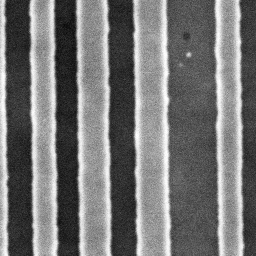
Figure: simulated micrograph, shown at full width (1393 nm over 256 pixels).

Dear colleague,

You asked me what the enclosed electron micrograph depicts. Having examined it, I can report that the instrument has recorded lines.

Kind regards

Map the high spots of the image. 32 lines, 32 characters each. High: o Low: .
o...ooo...ooo....oooo......ooo..
o...ooo...ooo....oooo......ooo..
o...ooo...ooo....oooo......ooo..
o...ooo...ooo....oooo......ooo..
o...ooo...ooo....oooo......ooo..
o...ooo...ooo....oooo......ooo..
o...ooo...ooo....oooo......ooo..
o...ooo...ooo....oooo......ooo..
o...ooo...ooo....oooo......ooo..
o...ooo...ooo....oooo......ooo..
o...ooo...oooo...oooo......ooo..
o...ooo...oooo...oooo......ooo..
o...ooo...oooo...oooo......ooo..
o...ooo...oooo...oooo......ooo..
o...ooo...ooo....oooo......ooo..
o...ooo...ooo....oooo......ooo..
o...ooo...ooo....oooo......ooo..
o...ooo...ooo....oooo......ooo..
o...ooo...oooo...oooo......ooo..
o...ooo...oooo...oooo......ooo..
o...ooo...oooo...oooo......ooo..
o...ooo...oooo...oooo......ooo..
o...ooo...oooo...oooo......ooo..
o...ooo...oooo...oooo......ooo..
o...ooo...oooo...oooo......ooo..
o...ooo...oooo...oooo......ooo..
o...ooo...oooo...oooo......ooo..
o...ooo...oooo...oooo......ooo..
o...ooo...oooo...oooo......ooo..
o...ooo...oooo...oooo......ooo..
o...ooo...oooo...oooo......ooo..
o...ooo...oooo...oooo.......oo..